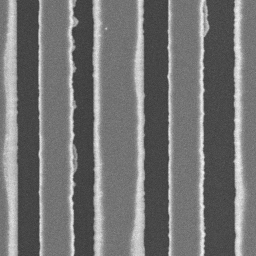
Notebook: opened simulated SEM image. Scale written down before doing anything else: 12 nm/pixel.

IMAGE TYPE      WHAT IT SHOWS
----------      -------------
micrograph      lines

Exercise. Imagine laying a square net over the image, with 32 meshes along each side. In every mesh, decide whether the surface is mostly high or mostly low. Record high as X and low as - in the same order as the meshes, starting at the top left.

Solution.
XX---XXXX---XXXXXX---XXXX----XXX
XX---XXXX---XXXXXX---XXXX----XXX
XX---XXXX---XXXXXX---XXXX----XXX
XX---XXXX---XXXXXX---XXXX----XXX
XX---XXXX---XXXXXX---XXXX----XXX
XX---XXXX---XXXXXX---XXXX----XXX
XX---XXXX---XXXXXX---XXXX----XXX
XX---XXXX---XXXXXX---XXXX-----XX
XX---XXXX---XXXXXX---XXXX----XXX
XX---XXXX---XXXXXX---XXXX----XXX
XX---XXXX---XXXXXX---XXXX-----XX
XX---XXXX---XXXXXX---XXXX----XXX
XX---XXXX---XXXXXX---XXXX----XXX
XX---XXXX---XXXXXX---XXXX----XXX
XX---XXXX---XXXXXX---XXXX----XXX
XX---XXXX---XXXXXX---XXXX----XXX
XX---XXXX---XXXXXX---XXXX----XXX
XX---XXXX---XXXXXX---XXXX----XXX
XX---XXXX---XXXXXX---XXXX-----XX
XX---XXXX---XXXXXX---XXXX-----XX
XX---XXXX---XXXXXX---XXXX----XXX
XX---XXXX---XXXXXX---XXXX-----XX
XX---XXXX---XXXXXX---XXXX-----XX
XX---XXXX---XXXXXX---XXXX-----XX
XX---XXXX---XXXXXX---XXXX-----XX
XX---XXXX---XXXXXX---XXXX-----XX
XX---XXXX---XXXXXX---XXXX-----XX
XX---XXXX---XXXXXX---XXXX-----XX
XX---XXXX---XXXXXX---XXXX-----XX
XX---XXXX---XXXXXX---XXXX-----XX
XX---XXXX---XXXXXX---XXXX-----XX
XX---XXXX---XXXXXX---XXXX-----XX